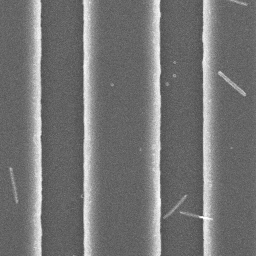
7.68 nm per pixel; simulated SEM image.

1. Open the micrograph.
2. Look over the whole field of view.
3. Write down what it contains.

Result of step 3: lines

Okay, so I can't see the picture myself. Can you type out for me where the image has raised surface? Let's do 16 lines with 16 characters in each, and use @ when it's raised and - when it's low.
@@---@@@@@---@@@
@@---@@@@@---@@@
@@---@@@@@---@@@
@@---@@@@@---@@@
@@---@@@@@---@@@
@@---@@@@@---@@@
@@---@@@@@---@@@
@@---@@@@@---@@@
@@---@@@@@---@@@
@@---@@@@@---@@@
@@---@@@@@---@@@
@@---@@@@@---@@@
@@---@@@@@---@@@
@@---@@@@@---@@@
@@---@@@@@---@@@
@@---@@@@@---@@@